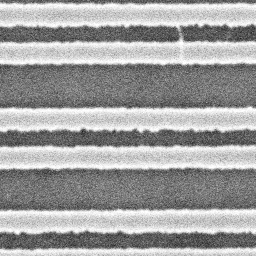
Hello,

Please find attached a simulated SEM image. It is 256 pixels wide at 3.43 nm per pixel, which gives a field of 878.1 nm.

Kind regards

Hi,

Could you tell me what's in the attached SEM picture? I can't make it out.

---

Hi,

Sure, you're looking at lines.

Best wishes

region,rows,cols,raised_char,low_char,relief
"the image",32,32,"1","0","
00000000000000000000000000000000
11111111111111111111111111111111
11111111111111111111111111111111
00000000000000000000000000000000
00000000000000000000000000000000
11111111111111111111111111111111
11111111111111111111111111111111
11111111111111111111111111111111
00000000000000000000000000000000
00000000000000000000000000000000
00000000000000000000000000000000
00000000000000000000000000000000
00000000000000000000000000000000
00000000000000000000000000000000
11111111111111111111111111111111
11111111111111111111111111111111
00000000000000000000000000000000
00000000000000000000000000000000
11111110111111011111111111111111
11111111111111111111111111111111
11111111111111111111111111111111
00000000000000000000000000000000
00000000000000000000000000000000
00000000000000000000000000000000
00000000000000000000000000000000
00000000000000000000000000000000
11111111111111111111111111111111
11111111111111111111111111111111
11111111111111111111111111111111
00000000000000000000000000000000
00000000000000000000000000000000
11111111111111111111111111111111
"